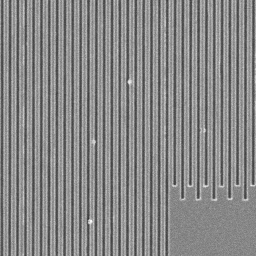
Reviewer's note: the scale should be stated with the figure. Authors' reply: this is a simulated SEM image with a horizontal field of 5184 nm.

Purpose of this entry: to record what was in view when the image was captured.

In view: parallel lines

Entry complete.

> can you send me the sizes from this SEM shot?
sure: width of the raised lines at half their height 91.1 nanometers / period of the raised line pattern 159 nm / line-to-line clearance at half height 73.4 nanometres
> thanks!